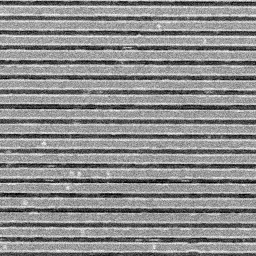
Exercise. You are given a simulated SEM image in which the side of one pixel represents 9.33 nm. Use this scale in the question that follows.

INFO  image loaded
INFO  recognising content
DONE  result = parallel lines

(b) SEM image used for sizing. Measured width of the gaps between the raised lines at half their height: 51.3 nanometres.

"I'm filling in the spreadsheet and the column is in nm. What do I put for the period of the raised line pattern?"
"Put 138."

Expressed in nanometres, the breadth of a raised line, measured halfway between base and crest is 84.